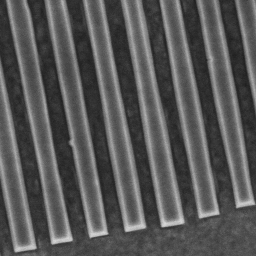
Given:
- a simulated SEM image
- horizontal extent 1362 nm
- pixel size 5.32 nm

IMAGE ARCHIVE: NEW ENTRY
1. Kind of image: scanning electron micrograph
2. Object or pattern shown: parallel lines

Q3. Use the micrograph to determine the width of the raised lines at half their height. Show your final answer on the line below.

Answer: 104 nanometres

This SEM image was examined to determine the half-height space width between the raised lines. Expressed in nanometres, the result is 94.7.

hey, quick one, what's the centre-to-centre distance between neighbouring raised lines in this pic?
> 198 nm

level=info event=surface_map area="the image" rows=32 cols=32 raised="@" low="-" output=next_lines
-@@---@@---@@--@@@--@@---@@---@@
-@@@--@@---@@---@@--@@@--@@---@@
-@@@--@@@--@@---@@--@@@--@@@--@@
-@@@--@@@--@@@--@@---@@--@@@--@@
--@@--@@@--@@@--@@---@@---@@--@@
--@@---@@---@@--@@@--@@---@@---@
--@@@--@@---@@--@@@--@@@--@@---@
--@@@--@@@--@@---@@--@@@--@@@--@
--@@@--@@@--@@---@@---@@--@@@--@
---@@--@@@--@@@--@@---@@--@@@--@
@--@@---@@--@@@--@@---@@---@@--@
@--@@---@@---@@--@@@--@@@--@@---
@--@@@--@@---@@--@@@--@@@--@@@--
@--@@@--@@@--@@---@@--@@@--@@@--
@---@@--@@@--@@@--@@--@@@--@@@--
@@--@@--@@@--@@@--@@@--@@---@@--
@@--@@---@@--@@@--@@@--@@---@@--
@@--@@---@@---@@--@@@--@@@--@@--
@@--@@@--@@@--@@--@@@--@@@--@@@-
@@---@@--@@@--@@@--@@---@@--@@@-
@@---@@--@@@--@@@--@@@--@@---@@-
@@@--@@---@@--@@@--@@@--@@---@@-
@@@--@@---@@---@@--@@@--@@@--@@-
@@@--@@@--@@---@@--@@@--@@@--@@-
-@@---@@--@@@--@@---@@--@@@--@@@
-@@---@@--@@@--@@@--@@@--@@---@-
-@@@--@@---@@--@@@--@@@--@@-----
-@@@--@@---@@--@@@--@@@---------
-@@@--@@@--@@---@@--------------
--@@--@@@-----------------------
--@@----------------------------
--------------------------------